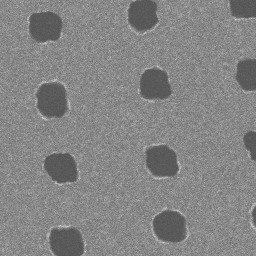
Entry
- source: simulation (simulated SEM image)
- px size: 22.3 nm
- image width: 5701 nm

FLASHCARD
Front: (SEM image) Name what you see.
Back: holes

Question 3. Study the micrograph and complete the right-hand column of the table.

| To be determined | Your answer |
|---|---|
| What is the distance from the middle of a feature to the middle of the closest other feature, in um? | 1.51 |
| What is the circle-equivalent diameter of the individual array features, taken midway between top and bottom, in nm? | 734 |